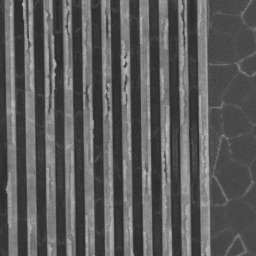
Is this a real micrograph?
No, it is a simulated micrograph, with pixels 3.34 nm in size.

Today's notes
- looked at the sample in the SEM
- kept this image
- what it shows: parallel lines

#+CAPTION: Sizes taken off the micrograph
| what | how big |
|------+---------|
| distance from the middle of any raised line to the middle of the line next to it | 64.3 nm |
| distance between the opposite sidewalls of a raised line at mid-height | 30.9 nanometres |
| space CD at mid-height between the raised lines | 0.0342 µm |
